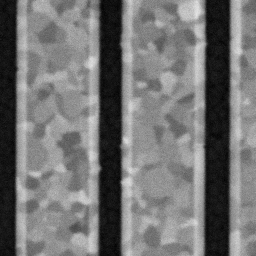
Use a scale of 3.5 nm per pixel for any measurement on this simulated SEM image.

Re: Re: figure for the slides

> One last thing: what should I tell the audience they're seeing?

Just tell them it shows one or a few lines or trenches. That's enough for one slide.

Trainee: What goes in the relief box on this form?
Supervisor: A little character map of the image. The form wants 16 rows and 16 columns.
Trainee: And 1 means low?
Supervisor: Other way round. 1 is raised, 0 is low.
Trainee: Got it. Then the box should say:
0111110011111001
0111110011111001
0111110011111001
0111110011111001
0111110011111001
0111110011111001
0111110011110001
0111110011110001
0111110011110001
0111110011110001
0111110011110001
0111110011110001
0111110011110001
0111110011110001
0111110011110001
0111110011110001